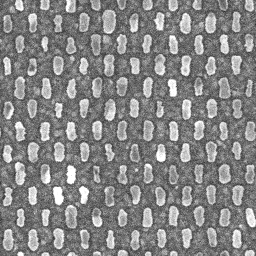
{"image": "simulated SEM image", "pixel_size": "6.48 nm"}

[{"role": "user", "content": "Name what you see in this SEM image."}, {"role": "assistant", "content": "a regular array of raised bodies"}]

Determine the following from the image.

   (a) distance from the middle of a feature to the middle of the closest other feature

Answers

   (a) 157 nanometres